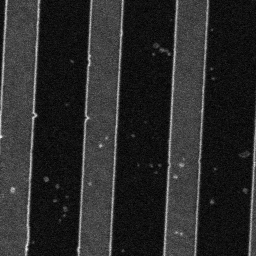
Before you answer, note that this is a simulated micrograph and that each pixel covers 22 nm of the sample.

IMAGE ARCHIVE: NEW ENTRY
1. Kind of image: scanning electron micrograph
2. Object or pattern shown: one or a few lines or trenches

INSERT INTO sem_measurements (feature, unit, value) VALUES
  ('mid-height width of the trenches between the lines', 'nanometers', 681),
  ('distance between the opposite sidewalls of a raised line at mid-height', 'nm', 1210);